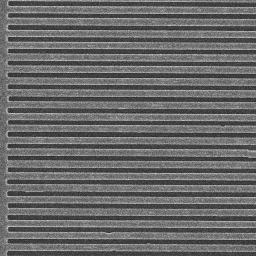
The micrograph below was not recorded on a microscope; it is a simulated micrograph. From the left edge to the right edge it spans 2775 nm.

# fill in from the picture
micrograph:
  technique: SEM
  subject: parallel lines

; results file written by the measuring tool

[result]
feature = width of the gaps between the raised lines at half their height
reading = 0.0515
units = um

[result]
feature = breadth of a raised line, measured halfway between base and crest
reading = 73.2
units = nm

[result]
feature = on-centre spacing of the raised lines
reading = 129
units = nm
